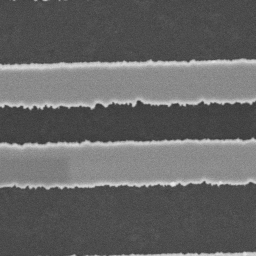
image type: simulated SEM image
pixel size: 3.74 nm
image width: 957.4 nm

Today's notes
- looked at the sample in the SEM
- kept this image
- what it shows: lines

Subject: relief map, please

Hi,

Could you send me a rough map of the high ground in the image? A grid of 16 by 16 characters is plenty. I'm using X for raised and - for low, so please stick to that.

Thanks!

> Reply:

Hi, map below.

----------------
----------------
----------------
----------------
XXXXXXXXXXXXXXXX
XXXXXXXXXXXXXXXX
XXXXXXX--XXX----
----------------
----------------
XXXXXXXXXXXXXXXX
XXXXXXXXXXXXXXXX
XXXXXXXXXXXX-XX-
----------------
----------------
----------------
----------------